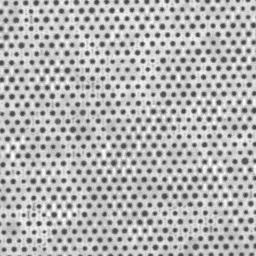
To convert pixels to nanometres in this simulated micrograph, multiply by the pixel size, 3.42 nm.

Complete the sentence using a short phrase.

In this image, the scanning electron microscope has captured a regular array of holes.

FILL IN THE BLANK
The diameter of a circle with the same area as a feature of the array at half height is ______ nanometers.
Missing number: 16.8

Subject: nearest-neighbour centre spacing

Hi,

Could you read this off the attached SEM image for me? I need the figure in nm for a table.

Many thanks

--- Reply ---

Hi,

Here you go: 32.8